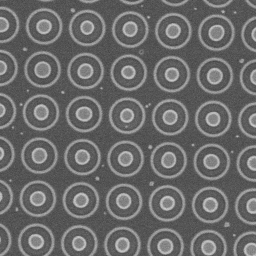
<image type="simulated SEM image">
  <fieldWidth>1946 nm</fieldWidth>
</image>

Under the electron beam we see an array of small figures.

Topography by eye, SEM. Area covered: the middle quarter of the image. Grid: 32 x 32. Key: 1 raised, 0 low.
10001100011100000000111000000001
10001110001100011000111000110001
10001110011100011000111001110001
11000000011100000000111000110001
11000000011110000001111000000001
11100001111111000001111100000011
11111111111111111111111110001111
11111111111111111111111111111111
11110011111111111111111111111111
11000000111111000011111110001111
10000000011100000001111100000011
10001100011100010000111000000011
10011110011100111000110001110001
10001100011100111000110001110001
10000000011100000000111001110001
11000000111110000001111000000011
11110011111111000011111100000111
11111111111111111111111111011111
11111111111111111111111111111111
11100011111111101111111111111111
11000000111110000011111100001111
10000000111100000001111000000111
00011100011000110001110001100011
00011100011000111000110001110011
10011100011000111001110001110011
10000000111100000001110001100011
11000001111100000011111000000111
11110111111111000111111100000111
11111111111111111111111111111111
11111111111111111111111111111111
11000011111111001111111111111111
10000001111100000011111000001111